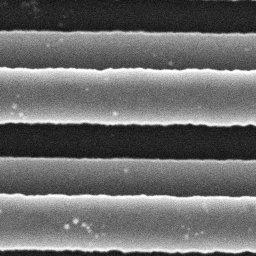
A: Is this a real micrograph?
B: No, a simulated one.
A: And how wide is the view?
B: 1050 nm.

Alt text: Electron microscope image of lines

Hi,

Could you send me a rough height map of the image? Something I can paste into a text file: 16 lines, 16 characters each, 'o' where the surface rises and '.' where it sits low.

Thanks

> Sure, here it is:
................
................
oooooooooooooooo
oooooooooooooooo
oooooooooooooooo
oooooooooooooooo
oooooooooooooooo
oooooooooooooooo
................
................
oooooooooooooooo
oooooooooooooooo
oooooooooooooooo
oooooooooooooooo
oooooooooooooooo
oooooooooooooooo